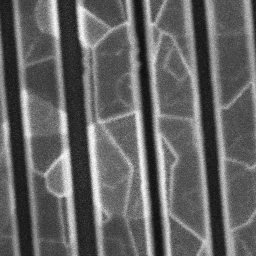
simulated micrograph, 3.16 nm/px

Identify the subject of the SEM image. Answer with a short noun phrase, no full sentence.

one or a few lines or trenches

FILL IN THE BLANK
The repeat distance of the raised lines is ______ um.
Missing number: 0.207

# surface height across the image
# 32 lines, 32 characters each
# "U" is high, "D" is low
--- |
DDUUUUUDDDUUUUUUDDUUUUUUDDUUUUUD
DDUUUUUDDDUUUUUUDDUUUUUUDDUUUUUD
DDUUUUUDDDUUUUUUDDUUUUUUDDUUUUUD
DDUUUUUDDDUUUUUUUDUUUUUUDDUUUUUD
DDUUUUUDDDUUUUUUUDUUUUUUDDUUUUUD
DDUUUUUDDDUUUUUUUDUUUUUUDDUUUUUU
DDUUUUUDDDDUUUUUUDDUUUUUDDDUUUUU
DDDUUUUDDDDUUUUUUDDUUUUUDDDUUUUU
DDDUUUUDDDDUUUUUUDDUUUUUDDDUUUUU
DDDUUUUUDDDUUUUUUDDUUUUUDDDUUUUU
DDDUUUUUDDDUUUUUUDDUUUUUUDDUUUUU
DDDUUUUUDDDUUUUUUDDUUUUUUDDUUUUU
DDDUUUUUDDDUUUUUUDDUUUUUUDDUUUUU
UDDUUUUUDDDUUUUUUDDUUUUUUDDUUUUU
UDDUUUUUDDDUUUUUUDDUUUUUUDDUUUUU
UDDUUUUUDDDUUUUUUUDUUUUUUDDUUUUU
UDDUUUUUDDDUUUUUUUDDUUUUUDDUUUUU
UDDUUUUUDDDUUUUUUUDDUUUUUDDUUUUU
UDDUUUUUDDDUUUUUUUDDUUUUUDDDUUUU
UDDUUUUUDDDDUUUUUUDDUUUUUDDDUUUU
UDDDUUUUUDDDUUUUUUDDUUUUUDDDUUUU
UDDDUUUUUDDDUUUUUUDDUUUUUDDDUUUU
UDDDUUUUUDDDUUUUUUDDUUUUUDDDUUUU
UDDDUUUUUDDDUUUUUUDDUUUUUUDDUUUU
UDDDUUUUUDDDUUUUUUDDUUUUUUDDUUUU
UUDDUUUUUDDDUUUUUUUDUUUUUUDDUUUU
UUDDUUUUUDDDUUUUUUUDUUUUUUDDUUUU
UUDDUUUUUDDDUUUUUUUDUUUUUUDDUUUU
UUDDUUUUUDDDUUUUUUUDDUUUUUDDUUUU
UUDDUUUUUDDDUUUUUUUDDUUUUUDDUUUU
UUDDUUUUUDDDUUUUUUUDDUUUUUDDUUUU
UUDDDUUUUDDDDUUUUUUDDUUUUUDDDUUU